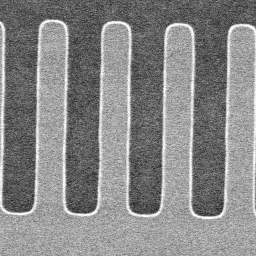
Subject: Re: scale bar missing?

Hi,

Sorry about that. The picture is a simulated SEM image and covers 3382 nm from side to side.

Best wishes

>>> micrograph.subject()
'groups of lines, slits or small figures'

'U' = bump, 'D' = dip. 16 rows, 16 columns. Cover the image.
DDDDDDDDDDDDDDDD
DDDUDDDUDDDDDDDD
DDUUDDUUDDUUDDUU
DDUUDDUUDDUUDDUU
DDUUDDUUDDUUDDUU
DDUUDDUUDDUUDDUU
DDUUDDUUDDUUDDUU
DDUUDDUUDDUUDDUU
DDUUDDUUDDUUDDUU
DDUUDDUUDDUUDDUU
DDUUDDUUDDUUDDUU
DDUUDDUUDDUUDDUU
DDUUDDUUDDUUDDUU
UUUUUUUUUUUUUUUU
UUUUUUUUUUUUUUUU
UUUUUUUUUUUUUUUU